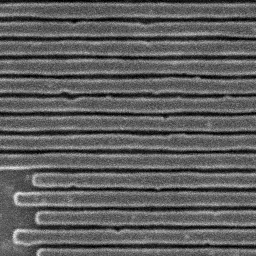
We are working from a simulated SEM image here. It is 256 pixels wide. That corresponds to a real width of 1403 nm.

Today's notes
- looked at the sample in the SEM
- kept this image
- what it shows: parallel lines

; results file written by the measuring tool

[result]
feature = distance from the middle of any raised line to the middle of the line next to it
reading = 103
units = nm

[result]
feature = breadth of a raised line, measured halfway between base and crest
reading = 74.7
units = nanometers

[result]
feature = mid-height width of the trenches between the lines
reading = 31.5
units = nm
